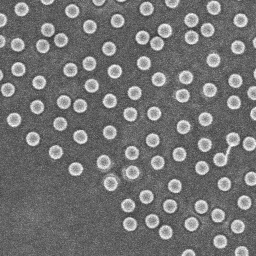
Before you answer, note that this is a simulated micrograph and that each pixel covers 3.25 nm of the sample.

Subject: a regular array of raised bodies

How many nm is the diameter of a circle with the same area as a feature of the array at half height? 43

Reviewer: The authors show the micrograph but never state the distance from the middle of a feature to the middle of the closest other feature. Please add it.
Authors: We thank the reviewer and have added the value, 73.6 nm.